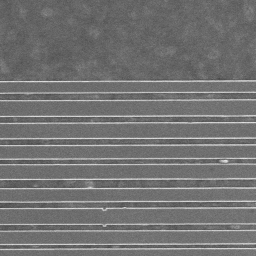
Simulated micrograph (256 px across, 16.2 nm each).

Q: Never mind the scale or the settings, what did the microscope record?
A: parallel lines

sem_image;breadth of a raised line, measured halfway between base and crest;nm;234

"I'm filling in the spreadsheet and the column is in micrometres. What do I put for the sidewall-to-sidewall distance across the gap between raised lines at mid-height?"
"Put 0.103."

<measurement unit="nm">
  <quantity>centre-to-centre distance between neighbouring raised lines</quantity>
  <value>349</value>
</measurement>